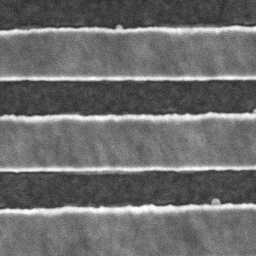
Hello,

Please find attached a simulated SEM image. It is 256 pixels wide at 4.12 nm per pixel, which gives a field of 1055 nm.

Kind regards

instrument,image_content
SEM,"lines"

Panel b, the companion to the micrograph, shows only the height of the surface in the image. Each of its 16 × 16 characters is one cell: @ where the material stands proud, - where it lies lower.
----------------
----------------
@@@@@@@@@@@@@@@@
@@@@@@@@@@@@@@@@
@@@@@@@@@@@@@@@@
----------------
----------------
@@@@@@@@@@@@@@@@
@@@@@@@@@@@@@@@@
@@@@@@@@@@@@@@@@
@@@@@@@@@@@@@@@@
----------------
----------------
@@@@@@@@@@@@@@@@
@@@@@@@@@@@@@@@@
@@@@@@@@@@@@@@@@